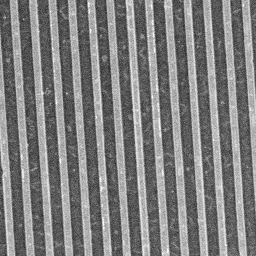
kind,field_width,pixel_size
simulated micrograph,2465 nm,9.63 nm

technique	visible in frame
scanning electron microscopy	parallel lines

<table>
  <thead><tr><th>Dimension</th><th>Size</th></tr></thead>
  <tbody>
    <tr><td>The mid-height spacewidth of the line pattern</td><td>120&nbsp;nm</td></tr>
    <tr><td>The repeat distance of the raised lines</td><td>186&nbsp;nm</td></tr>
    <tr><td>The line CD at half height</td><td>63.6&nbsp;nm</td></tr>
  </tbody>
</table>